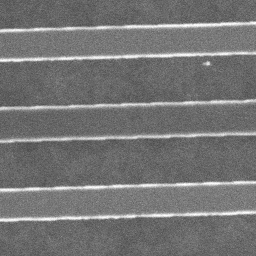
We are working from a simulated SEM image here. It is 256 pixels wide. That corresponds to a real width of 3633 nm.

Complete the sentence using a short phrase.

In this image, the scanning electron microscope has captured lines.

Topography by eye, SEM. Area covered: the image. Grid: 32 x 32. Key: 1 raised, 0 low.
00000000000000000000000000000000
00000000000000000000000000000000
00000000000000000000000000000000
00000000111111111111111111111111
11111111111111111111111111111111
11111111111111111111111111111111
11111111111111111111111111111111
00000000000000000000000000000000
00000000000000000000000000000000
00000000000000000000000000000000
00000000000000000000000000000000
00000000000000000000000000000000
00000000000000000000000000000000
11111111111111111111111111111111
11111111111111111111111111111111
11111111111111111111111111111111
11111111111111111111111111111111
11111100000000000000000000000000
00000000000000000000000000000000
00000000000000000000000000000000
00000000000000000000000000000000
00000000000000000000000000000000
00000000000000000000000000000000
00000001111111111111111111111111
11111111111111111111111111111111
11111111111111111111111111111111
11111111111111111111111111111111
10000000000000000000000000000000
00000000000000000000000000000000
00000000000000000000000000000000
00000000000000000000000000000000
00000000000000000000000000000000